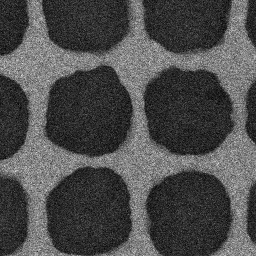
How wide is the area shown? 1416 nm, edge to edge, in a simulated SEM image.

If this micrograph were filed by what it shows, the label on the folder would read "holes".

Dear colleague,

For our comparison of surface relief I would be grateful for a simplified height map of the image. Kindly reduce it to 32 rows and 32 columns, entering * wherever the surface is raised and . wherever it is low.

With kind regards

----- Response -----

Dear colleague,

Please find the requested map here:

...**...........**...........**.
....*...........**...........**.
....**..........**...........**.
...***..........**..........***.
...***..........**..........***.
..*****........*****........****
.********.....*******....*******
********************************
************..*******.**********
*********......*****.......*****
..*****........***..........****
...***..........**..........***.
...***..........**...........**.
...***...........*...........**.
....**..........**...........**.
....**..........**...........**.
...***..........***..........**.
...***..........***.........****
...*****.......******......*****
..*********.********************
********************************
*********.....********...*******
..******.......*****.......*****
...****.........***.........***.
...***..........***..........**.
....**..........**...........**.
....**..........**...........**.
....**..........**...........**.
...***..........**...........**.
...***..........***..........**.
...****........****.........****
..******......******.......*****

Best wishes